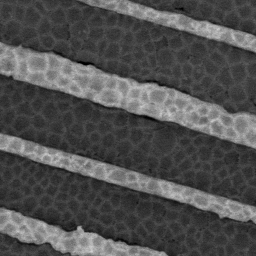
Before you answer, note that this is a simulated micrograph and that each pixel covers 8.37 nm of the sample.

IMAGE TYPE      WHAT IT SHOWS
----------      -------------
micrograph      one or a few lines or trenches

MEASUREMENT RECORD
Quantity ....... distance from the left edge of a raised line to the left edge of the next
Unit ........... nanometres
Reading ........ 674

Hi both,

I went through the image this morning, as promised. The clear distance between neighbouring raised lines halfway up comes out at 471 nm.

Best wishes